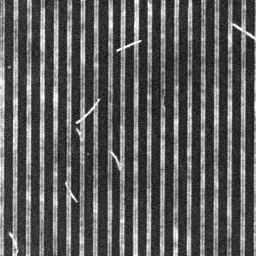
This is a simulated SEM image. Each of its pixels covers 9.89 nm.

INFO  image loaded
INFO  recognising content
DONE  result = parallel lines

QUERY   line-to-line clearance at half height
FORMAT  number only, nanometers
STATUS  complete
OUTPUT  103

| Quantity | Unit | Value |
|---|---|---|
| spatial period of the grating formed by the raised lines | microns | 0.133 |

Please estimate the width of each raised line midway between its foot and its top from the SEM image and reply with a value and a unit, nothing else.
0.0297 um